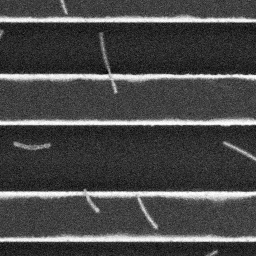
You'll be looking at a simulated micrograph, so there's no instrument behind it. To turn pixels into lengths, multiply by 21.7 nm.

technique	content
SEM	lines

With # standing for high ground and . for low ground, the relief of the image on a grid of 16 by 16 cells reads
################
................
................
................
................
################
################
################
................
................
................
................
################
################
################
................